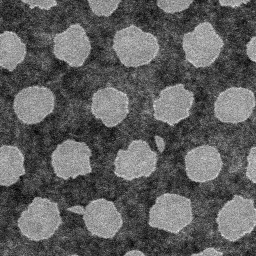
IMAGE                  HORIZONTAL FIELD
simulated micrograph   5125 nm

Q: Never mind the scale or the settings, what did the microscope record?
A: a regular array of raised bodies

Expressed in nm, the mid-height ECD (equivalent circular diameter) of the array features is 770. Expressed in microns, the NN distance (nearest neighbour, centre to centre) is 1.23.